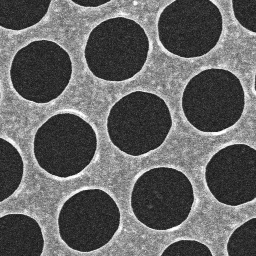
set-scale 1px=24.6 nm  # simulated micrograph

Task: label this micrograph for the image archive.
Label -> holes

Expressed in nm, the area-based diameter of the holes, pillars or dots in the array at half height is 1560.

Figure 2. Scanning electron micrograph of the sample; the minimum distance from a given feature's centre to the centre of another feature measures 1890 nm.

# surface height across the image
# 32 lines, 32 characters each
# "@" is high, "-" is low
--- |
------@@@@---@@@@@@@@------@@---
------@@@@@@@@@@@@@@--------@---
-----@@@@@@@@----@@@--------@@--
---@@@@@@@@@------@@--------@@@-
@@@@@@@@@@@-------@@--------@@@@
@@@@---@@@@--------@-------@@@@@
@@------@@@--------@@-----@@@@@@
@@-------@@-------@@@@@@@@@@@@@@
@--------@@-------@@@@@@@@@@@@@@
@--------@@@-----@@@@@@@-----@@@
@-------@@@@@@@@@@@@@@@-------@@
@@------@@@@@@@@@-@@@@@-------@@
@@@----@@@@@@@@-----@@@--------@
@@@@@@@@@@@@@@-------@@-------@@
@@@@@@@---@@@@-------@@-------@@
@@@@@------@@--------@@@-----@@@
@@@@@-------@--------@@@@@-@@@@@
-@@@--------@@-------@@@@@@@@@@@
--@@--------@@@-----@@@@@@@@----
---@--------@@@@@@@@@@@@@@@-----
---@@------@@@@@@@@@@@@@@@------
---@@@----@@@@@@@@-----@@@------
---@@@@@@@@@@@@@@-------@@------
--@@@@@@@@@@@@@@@-------@@------
-@@@@@@@@-----@@--------@@@-----
@@@@@@@@-------@--------@@@@--@@
@@@@@@@--------@@-------@@@@@@@@
----@@@--------@@------@@@@@@@@-
-----@@--------@@@@--@@@@@@@@@--
-----@@@------@@@@@@@@@@@@@@@---
-----@@@-----@@@@@@@@----@@@----
-----@@@@@-@@@@@@@@@------@@----